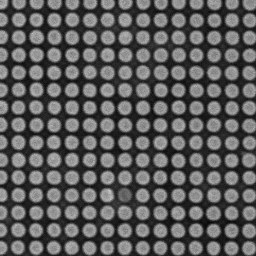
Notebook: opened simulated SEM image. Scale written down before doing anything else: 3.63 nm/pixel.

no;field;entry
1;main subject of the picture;a regular array of raised bodies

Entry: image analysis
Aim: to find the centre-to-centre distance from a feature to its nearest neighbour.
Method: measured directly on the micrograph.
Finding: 63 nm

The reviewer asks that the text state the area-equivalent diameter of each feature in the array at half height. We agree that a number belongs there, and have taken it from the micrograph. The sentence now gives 49.1 nm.